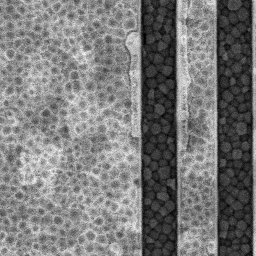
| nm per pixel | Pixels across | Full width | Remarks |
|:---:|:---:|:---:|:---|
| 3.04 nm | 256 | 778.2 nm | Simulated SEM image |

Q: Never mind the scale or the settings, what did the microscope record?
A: one or a few lines or trenches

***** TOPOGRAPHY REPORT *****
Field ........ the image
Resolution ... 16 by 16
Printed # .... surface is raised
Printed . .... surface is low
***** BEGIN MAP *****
#########..##...
#########..##...
#########..##...
#########..##...
#########..##...
#########..##...
#########..##...
#########..##...
#########..##...
#########..##...
#########..##...
#########..##...
#########..##...
#########..##...
#########..##...
#########..##...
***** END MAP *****